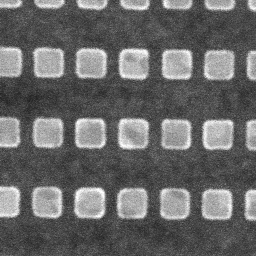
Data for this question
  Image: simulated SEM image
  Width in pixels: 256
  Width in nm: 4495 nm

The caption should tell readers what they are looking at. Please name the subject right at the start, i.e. a regular array of raised bodies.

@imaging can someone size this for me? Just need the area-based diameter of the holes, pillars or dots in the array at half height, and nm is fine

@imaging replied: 533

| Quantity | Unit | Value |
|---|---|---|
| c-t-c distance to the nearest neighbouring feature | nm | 742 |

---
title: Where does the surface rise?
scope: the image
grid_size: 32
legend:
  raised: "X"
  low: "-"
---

XX---XXX--XXX--XXXX--XXX--XXX--X
--------------------------------
--------------------------------
--------------------------------
--------------------------------
--------------------------------
XX---XX---XXX--XXX---XX---XXX---
XXX-XXXX--XXX--XXX--XXXX--XXX--X
XX--XXXX--XXX--XXX--XXXX--XXX--X
-----XX---XXX---XX---XXX--XXX--X
--------------------------------
--------------------------------
--------------------------------
--------------------------------
--------------------------------
XX--XXXX--XXX--XXX--XXX---XXX--X
XX--XXXX--XXX--XXX--XXXX--XXX--X
XX--XXXX--XXX--XXX--XXXX--XXX--X
----------------------X---XX---X
--------------------------------
--------------------------------
--------------------------------
--------------------------------
--------------------------------
XX--XXXX--XXX--XXX--XXX---XXX--X
XX--XXXX-XXXX--XXX--XXX--XXXX--X
XX--XXX---XXX--XXX--XXX--XXXX--X
--------------------------------
--------------------------------
--------------------------------
--------------------------------
--------------------------------